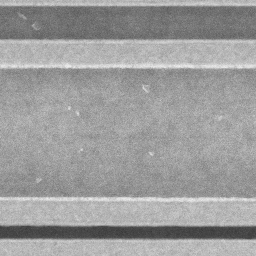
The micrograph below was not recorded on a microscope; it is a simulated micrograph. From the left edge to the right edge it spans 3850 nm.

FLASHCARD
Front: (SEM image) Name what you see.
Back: lines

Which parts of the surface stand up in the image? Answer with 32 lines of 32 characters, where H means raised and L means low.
HHHHHHHHHHHHHHHHHHHHHHHHHHHHHHHH
LLLLLLLLLLLLLLLLLLLLLLLLLLLLLLLL
LLLLLLLLLLLLLLLLLLLLLLLLLLLLLLLL
LLLLLLLLLLLLLLLLLLLLLLLLLLLLLLLL
LLLLLLLLLLLLLLLLLLLLLLLLLLLLLLLL
HHHHHHHHHHHHHHHHHHHHHHHHHHHHHHHH
HHHHHHHHHHHHHHHHHHHHHHHHHHHHHHHH
HHHHHHHHHHHHHHHHHHHHHHHHHHHHHHHH
LLLLLLLLLLLLLLLLLLLLLLLLLLLLLLLL
LLLLLLLLLLLLLLLLLLLLLLLLLLLLLLLL
LLLLLLLLLLLLLLLLLLLLLLLLLLLLLLLL
LLLLLLLLLLLLLLLLLLLLLLLLLLLLLLLL
LLLLLLLLLLLLLLLLLLLLLLLLLLLLLLLL
LLLLLLLLLLLLLLLLLLLLLLLLLLLLLLLL
LLLLLLLLLLLLLLLLLLLLLLLLLLLLLLLL
LLLLLLLLLLLLLLLLLLLLLLLLLLLLLLLL
LLLLLLLLLLLLLLLLLLLLLLLLLLLLLLLL
LLLLLLLLLLLLLLLLLLLLLLLLLLLLLLLL
LLLLLLLLLLLLLLLLLLLLLLLLLLLLLLLL
LLLLLLLLLLLLLLLLLLLLLLLLLLLLLLLL
LLLLLLLLLLLLLLLLLLLLLLLLLLLLLLLL
LLLLLLLLLLLLLLLLLLLLLLLLLLLLLLLL
LLLLLLLLLLLLLLLLLLLLLLLLLLLLLLLL
LLLLLLLLLLLLLLLLLLLLLLLLLLLLLLLL
LLLLLLLLLLLLLLLLLLLLLLLLLLLLLLLL
HHHHHHHHHHHHHHHHHHHHHHHHHHHHHHHH
HHHHHHHHHHHHHHHHHHHHHHHHHHHHHHHH
HHHHHHHHHHHHHHHHHHHHHHHHHHHHHHHH
LLLLLLLLLLLLLLLLLLLLLLLLLLLLLLLL
LLLLLLLLLLLLLLLLLLLLLLLLLLLLLLLL
HHHHHHHHHHHHHHHHHHHHHHHHHHHHHHHH
HHHHHHHHHHHHHHHHHHHHHHHHHHHHHHHH